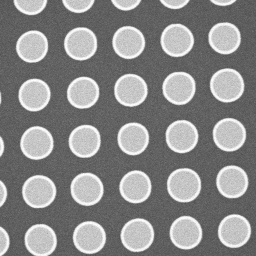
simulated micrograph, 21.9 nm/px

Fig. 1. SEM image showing an array of small figures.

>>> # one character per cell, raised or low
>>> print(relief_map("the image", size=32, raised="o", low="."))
..oooo..oooo..ooo...ooo....oo...
...oo....oo.....................
................................
..........o....oo....oo....ooo..
...ooo..oooo..oooo..oooo..oooo..
..oooo..oooo..oooo..oooo..oooo..
..oooo..oooo...ooo...oo....oo...
...oo...........................
................................
...............oo....ooo...ooo..
...ooo...ooo..oooo..oooo..oooo..
..oooo..oooo..oooo..oooo..oooo..
..oooo...ooo...ooo...ooo...oo...
...oo...........................
................................
................o.....oo...ooo..
...ooo...ooo...ooo...oooo..oooo.
...oooo..ooo...oooo..oooo..oooo.
...oooo..ooo...ooo...ooo...ooo..
...ooo....o.....................
................................
................oo....oo...oooo.
...ooo...ooo...oooo..oooo..oooo.
o..oooo..oooo..oooo..oooo..oooo.
o..oooo..oooo..oooo..oooo...oo..
....oo....oo....................
................................
................oo....oo....ooo.
....oo....ooo..oooo..oooo..oooo.
o..oooo..oooo..oooo..oooo..oooo.
o..oooo..oooo..oooo...ooo...ooo.
o...ooo...oo....................